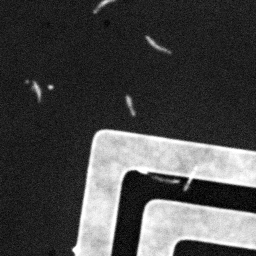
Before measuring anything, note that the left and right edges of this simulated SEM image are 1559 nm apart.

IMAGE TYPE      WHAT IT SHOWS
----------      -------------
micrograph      groups of lines, slits or small figures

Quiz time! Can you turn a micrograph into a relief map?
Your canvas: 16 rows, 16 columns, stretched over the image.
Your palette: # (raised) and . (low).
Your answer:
................
................
................
................
................
................
................
................
......###.......
......##########
......##########
.....###.......#
.....##.........
.....##..#######
.....##..#######
.....##..##....#